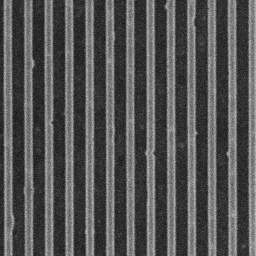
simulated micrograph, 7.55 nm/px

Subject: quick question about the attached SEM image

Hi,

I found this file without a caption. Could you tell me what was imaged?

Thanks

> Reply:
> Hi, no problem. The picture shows parallel lines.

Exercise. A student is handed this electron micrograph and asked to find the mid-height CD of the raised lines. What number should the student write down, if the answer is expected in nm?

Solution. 53.8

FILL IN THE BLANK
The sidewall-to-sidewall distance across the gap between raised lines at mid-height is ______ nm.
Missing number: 102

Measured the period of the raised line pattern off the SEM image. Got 154 nm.